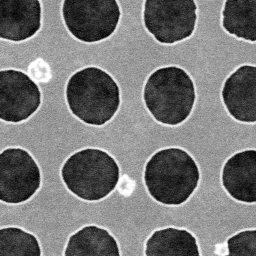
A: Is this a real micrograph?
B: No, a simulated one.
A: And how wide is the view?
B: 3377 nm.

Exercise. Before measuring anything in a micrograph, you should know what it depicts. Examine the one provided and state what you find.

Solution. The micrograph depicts holes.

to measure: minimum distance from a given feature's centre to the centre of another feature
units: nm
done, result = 1020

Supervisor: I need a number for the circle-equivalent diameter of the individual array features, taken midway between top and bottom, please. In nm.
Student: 730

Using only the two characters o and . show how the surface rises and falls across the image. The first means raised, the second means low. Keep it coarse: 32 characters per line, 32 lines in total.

.....ooo.......ooo......oooo....
.....ooo.......ooo......oooo....
.....ooo.......ooo......oooo....
.....ooo.......ooo......oooo....
....ooooo.....ooooo.....ooooo...
oooooooooooooooooooooooooooooooo
oooooooooooooooooooooooooooooooo
oooooooooooooooooooooooooooooooo
ooooooooooo.oooooooo..oooooooo..
....ooooo.....ooooo.....ooooo...
.....ooo.......ooo......oooo....
.....ooo.......ooo......oooo....
.....ooo.......ooo......oooo....
.....oooo......ooo......oooo....
....ooooo.....ooooo.....ooooo...
ooooooooooo..oooooooo.oooooooooo
oooooooooooooooooooooooooooooooo
oooooooooooooooooooooooooooooooo
o.ooooooooooooooooooo.oooooooooo
....ooooo.....ooooo.....ooooo...
.....ooo.......ooo......oooo....
.....ooo.......ooo.......ooo....
.....ooo.......ooo.......ooo....
.....ooo......oooo......oooo....
....oooooo...oooooo.....ooooo...
ooooooooooooooooooooo..ooooooooo
oooooooooooooooooooooooooooooooo
oooooooooooooooooooooooooooooooo
o.oooooooo...oooooooo.oooooooooo
....ooooo.....ooooo.....ooooo...
.....ooo.......ooo.......ooo....
.....ooo.......ooo.......ooo....